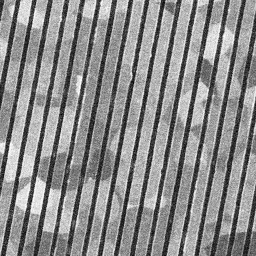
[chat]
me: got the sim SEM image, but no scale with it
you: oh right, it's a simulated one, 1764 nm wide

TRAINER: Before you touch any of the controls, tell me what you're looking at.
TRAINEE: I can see parallel lines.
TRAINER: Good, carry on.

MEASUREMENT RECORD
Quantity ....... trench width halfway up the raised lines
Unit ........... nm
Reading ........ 37.3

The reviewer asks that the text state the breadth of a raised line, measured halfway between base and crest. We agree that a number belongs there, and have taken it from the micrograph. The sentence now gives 0.0746 µm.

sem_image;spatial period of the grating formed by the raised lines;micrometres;0.109